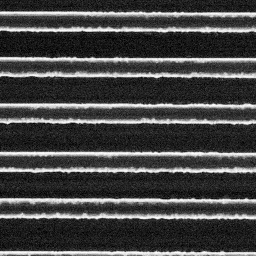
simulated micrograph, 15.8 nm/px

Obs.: lines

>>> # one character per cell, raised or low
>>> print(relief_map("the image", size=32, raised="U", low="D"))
DDDDDDDDDDDDDDDDDDDDDDDDDDDDDDDD
DDDDDDDDDDDDDDDDDDDDDDDDDDDDDDDD
UUUUUUUUUUUUUUUUUUUUUUUUUUUUUUUU
UUUUUUUUUUUUUUUUUUUUUUUUUUUUUUUU
DDDDDDDDDDDDDDDDDDDDDDDDDDDDDDDD
DDDDDDDDDDDDDDDDDDDDDDDDDDDDDDDD
DDDDDDDDDDDDDDDDDDDDDDDDDDDDDDDD
UUUUUUUUUUUUUUUUUUUUUUUUUUUUUUUU
UUUUUUUUUUUUUUUUUUUUUUUUUUUUUUUU
DDUDDDDUUUUDDUUUUUUUUUUUUUUUUUUU
DDDDDDDDDDDDDDDDDDDDDDDDDDDDDDDD
DDDDDDDDDDDDDDDDDDDDDDDDDDDDDDDD
DDDDDDDDDDDDDDDDDDDDDDDDDDDDDDDD
UUUUUUUUUUUUUUUUUUUUUUUUUUUUUUUU
UUUUUUUUUUUUUUUUUUUUUUUUUUUUUUUU
DDDDDDDDDDDDDDDDDDDDDDDDDDDDDDDD
DDDDDDDDDDDDDDDDDDDDDDDDDDDDDDDD
DDDDDDDDDDDDDDDDDDDDDDDDDDDDDDDD
DDDDDDDDDDDDDDDDDDDDDDDDDDDDDDDD
UUUUUUUUUUUUUUUUUUUUUUUUUUUUUUUU
UUUUUUUUUUUUUUUUUUUUUUUUUUUUUUUU
DDDDDDDDDDDDDDDDDDDDDDDDDDDDDDDD
DDDDDDDDDDDDDDDDDDDDDDDDDDDDDDDD
DDDDDDDDDDDDDDDDDDDDDDDDDDDDDDDD
DDDDDDDDDDDDDDDDDDDDDDDDDDDDDDDD
UUUUUUUUUUUUUUUUUUUUUUUUUUUUUUUU
UUUUUUUUUUUUUUUUUUUUUUUUUUUUUUUU
DDDDDDDDDDDDDDDDDDDDDDDDDDDDDDDD
DDDDDDDDDDDDDDDDDDDDDDDDDDDDDDDD
DDDDDDDDDDDDDDDDDDDDDDDDDDDDDDDD
DDDDDDDDDDDDDDDDDDDDDDDDDDDDDDDD
DDDDDDDDDDDDDDDDDDDDDDDDDDDDDDDD